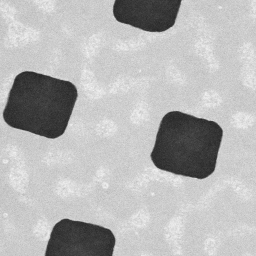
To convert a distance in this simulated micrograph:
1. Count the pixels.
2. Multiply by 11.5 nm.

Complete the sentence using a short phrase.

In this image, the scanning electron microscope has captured holes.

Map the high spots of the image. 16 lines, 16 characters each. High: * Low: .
*******....*****
********...*****
****************
****************
****************
*....***********
.....***********
....******...***
***.******....**
**********....**
**********...***
****************
****************
****************
***....*********
***....*********